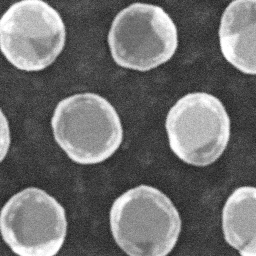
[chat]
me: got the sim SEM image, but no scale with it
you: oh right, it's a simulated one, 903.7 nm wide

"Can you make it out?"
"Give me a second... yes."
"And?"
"raised bodies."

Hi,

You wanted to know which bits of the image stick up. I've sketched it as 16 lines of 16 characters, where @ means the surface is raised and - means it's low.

-@@-----@@----@@
@@@@---@@@@---@@
@@@@---@@@@---@@
@@@----@@@@---@@
---------------@
----------------
----@@@----@@@--
---@@@@---@@@@--
@--@@@@----@@@--
----@@@----@@@--
----------------
----------------
-@@-----@@----@@
@@@@---@@@@---@@
@@@@---@@@@---@@
-@@@----@@@----@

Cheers